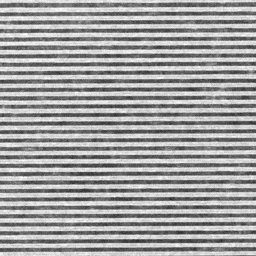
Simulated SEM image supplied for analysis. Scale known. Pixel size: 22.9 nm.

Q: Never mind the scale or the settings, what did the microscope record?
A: parallel lines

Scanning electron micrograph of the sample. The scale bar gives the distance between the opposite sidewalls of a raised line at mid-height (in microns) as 0.0687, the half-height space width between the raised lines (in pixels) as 5.5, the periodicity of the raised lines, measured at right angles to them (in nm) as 193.